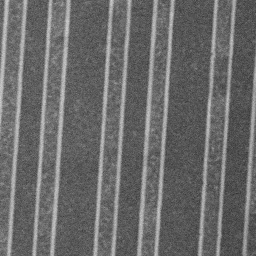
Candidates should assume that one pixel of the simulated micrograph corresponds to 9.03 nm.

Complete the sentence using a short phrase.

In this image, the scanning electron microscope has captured parallel lines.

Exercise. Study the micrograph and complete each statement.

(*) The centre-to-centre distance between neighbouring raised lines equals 54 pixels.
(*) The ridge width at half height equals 18.2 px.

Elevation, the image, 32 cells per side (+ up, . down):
.++...++......++....++.....++...
.++...++......++...++......++...
.++...++......++...++......++...
.++...++......++...++......++...
.++...++......++...++......++...
.++...++......++...++......++...
.++...++......++...++......++...
+++...++......++...++......++...
+++...++.....+++...++......++...
+++...++.....+++...++......++...
++....++.....+++...++.....+++...
++....++.....++....++.....+++...
++....++.....++....++.....++....
++....++.....++....++.....++....
++...+++.....++....++.....++....
++...+++.....++....++.....++....
++...+++.....++...++......++....
++...++......++...++......++...+
++...++......++...++......++...+
++...++......++...++......++...+
++...++......++...++......++...+
++...++......++...++......++...+
++...++......++...++......++...+
++...++.....+++...++......++...+
++...++.....+++...++.....+++...+
++...++.....++....++.....+++...+
+....++.....++....++.....+++...+
+....++.....++....++.....++....+
+....++.....++....++.....++....+
+...+++.....++....++.....++....+
+...+++.....++....++.....++....+
+...++......++...++......++....+